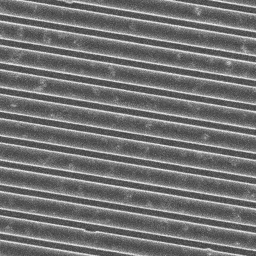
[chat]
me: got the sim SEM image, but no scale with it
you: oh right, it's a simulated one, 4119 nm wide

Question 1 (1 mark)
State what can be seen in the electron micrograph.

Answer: parallel lines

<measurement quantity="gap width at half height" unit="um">0.105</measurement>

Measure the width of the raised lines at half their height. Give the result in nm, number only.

272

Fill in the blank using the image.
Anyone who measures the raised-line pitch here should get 386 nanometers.